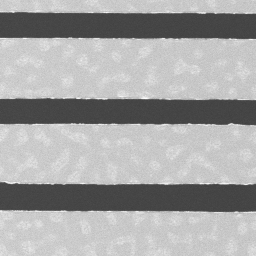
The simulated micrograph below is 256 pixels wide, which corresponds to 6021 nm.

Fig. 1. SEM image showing one or a few lines or trenches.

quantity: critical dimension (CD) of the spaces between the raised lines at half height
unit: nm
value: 1380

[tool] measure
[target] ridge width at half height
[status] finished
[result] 635 nm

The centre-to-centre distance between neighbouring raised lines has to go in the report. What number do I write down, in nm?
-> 2020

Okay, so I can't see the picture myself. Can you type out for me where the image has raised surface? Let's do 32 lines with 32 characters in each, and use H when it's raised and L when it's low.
LLLLLLLLLLLLLLLLLLLLLLLLLLLLLLLL
LHHHLLLLLLLLLLLLLLLLLLLLLLLLLLLL
HHHHHHHHHHHHHHHHHHHHHHHHHHHHHHHH
HHHHHHHHHHHHHHHHHHHHHHHHHHHHHHHH
HHHHHHHHHHHHHHHHHHHHHHHHHHHHHHHH
LLLLLLLLLLLLLLLLLLLLLLLLLLLLLLLL
LLLLLLLLLLLLLLLLLLLLLLLLLLLLLLLL
LLLLLLLLLLLLLLLLLLLLLLLLLLLLLLLL
LLLLLLLLLLLLLLLLLLLLLLLLLLLLLLLL
LLLLLLLLLLLLLLLLLLLLLLLLLLLLLLLL
LLLLLLLLLLLLLLLLLLLLLLLLLLLLLLLL
LLLLLLLLLLLLLLLLLLLLLLLLLLLLLLLL
HHHHHHHHHHHHHHHHHHHHHHHHHHHHHHHH
HHHHHHHHHHHHHHHHHHHHHHHHHHHHHHHH
HHHHHHHHHHHHHHHHHHHHHHHHHHHHHHHH
HHHHHHHLLHHHHHHHHHHHHHHHHHHHHHHH
LLLLLLLLLLLLLLLLLLLLLLLLLLLLLLLL
LLLLLLLLLLLLLLLLLLLLLLLLLLLLLLLL
LLLLLLLLLLLLLLLLLLLLLLLLLLLLLLLL
LLLLLLLLLLLLLLLLLLLLLLLLLLLLLLLL
LLLLLLLLLLLLLLLLLLLLLLLLLLLLLLLL
LLLLLLLLLLLLLLLLLLLLLLLLLLLLLLLL
LLLLLLLLLLLLLLLLLLLLLLLLLLLLLLLL
HHHHHHHHHHHHHHHHHHHHHHHHHHHHHHHH
HHHHHHHHHHHHHHHHHHHHHHHHHHHHHHHH
HHHHHHHHHHHHHHHHHHHHHHHHHHHHHHHH
LLLLLLLLLLLLLLLLLLLLLLLLLLHHHHHH
LLLLLLLLLLLLLLLLLLLLLLLLLLLLLLLL
LLLLLLLLLLLLLLLLLLLLLLLLLLLLLLLL
LLLLLLLLLLLLLLLLLLLLLLLLLLLLLLLL
LLLLLLLLLLLLLLLLLLLLLLLLLLLLLLLL
LLLLLLLLLLLLLLLLLLLLLLLLLLLLLLLL